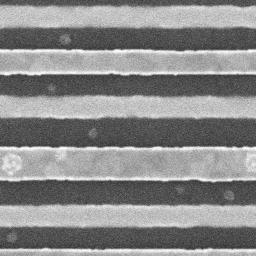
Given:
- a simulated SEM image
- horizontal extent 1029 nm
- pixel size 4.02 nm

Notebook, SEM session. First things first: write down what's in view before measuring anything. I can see lines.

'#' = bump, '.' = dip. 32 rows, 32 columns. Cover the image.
................................
################################
################################
................................
................................
................................
#####################....#######
################################
################################
................................
................................
................................
##......####################....
################################
.....########......#....#.####.#
................................
................................
................................
######.##..#.##.#..#...#####..#.
################################
################################
################################
.........................####...
................................
................................
................................
################################
################################
................................
................................
................................
################################